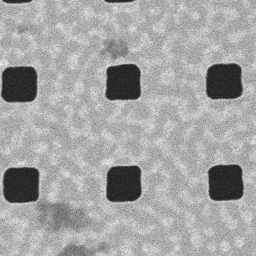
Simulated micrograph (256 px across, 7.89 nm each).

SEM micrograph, holes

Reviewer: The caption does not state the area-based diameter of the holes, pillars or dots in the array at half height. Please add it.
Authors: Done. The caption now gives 307 nm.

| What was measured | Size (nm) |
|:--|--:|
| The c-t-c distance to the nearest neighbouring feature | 796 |